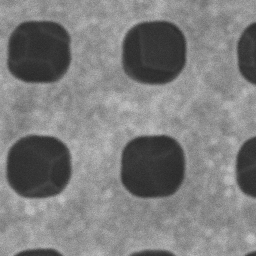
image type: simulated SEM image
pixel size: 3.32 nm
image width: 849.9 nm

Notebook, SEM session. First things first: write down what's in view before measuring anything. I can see holes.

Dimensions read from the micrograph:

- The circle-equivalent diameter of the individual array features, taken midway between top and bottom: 223 nm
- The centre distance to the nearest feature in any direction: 379 nanometres